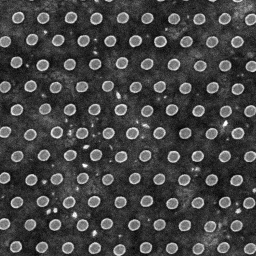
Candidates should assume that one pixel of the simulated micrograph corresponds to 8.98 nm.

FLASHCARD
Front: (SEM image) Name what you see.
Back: a regular array of raised bodies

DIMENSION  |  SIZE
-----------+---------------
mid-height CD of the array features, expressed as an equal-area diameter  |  99.3 nm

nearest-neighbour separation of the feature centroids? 225 nanometres